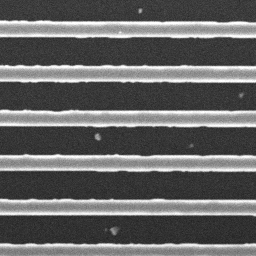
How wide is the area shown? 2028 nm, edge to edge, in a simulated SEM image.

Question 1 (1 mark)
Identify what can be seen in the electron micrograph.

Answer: lines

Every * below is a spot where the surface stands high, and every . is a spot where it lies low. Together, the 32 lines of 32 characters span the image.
................................
................................
................................
********************************
********************************
................................
................................
................................
********************************
********************************
................................
................................
................................
................................
********************************
********************************
................................
................................
................................
******************.*************
********************************
................................
................................
................................
................................
********************************
********************************
................................
................................
................................
................................
********************************